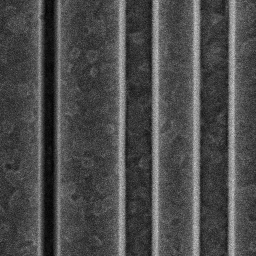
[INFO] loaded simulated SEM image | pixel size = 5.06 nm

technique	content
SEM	one or a few lines or trenches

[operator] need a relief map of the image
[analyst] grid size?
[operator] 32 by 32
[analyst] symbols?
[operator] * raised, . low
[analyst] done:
*****..********....******....***
*****..********....******....***
*****..********....******....***
*****..********....******....***
*****..********....******....***
*****..********....******....***
*****..********....******....***
*****..********....******....***
*****..********....******....***
*****..********....******....***
*****..********....******....***
*****..********....******....***
*****..********....******....***
*****..********....******....***
*****..********....******....***
*****..********....******....***
*****..********....******....***
*****..********....******....***
*****..********....******....***
*****..********....******....***
*****..********....******....***
*****..********....******....***
*****..********....******....***
*****..********....******....***
*****..********....******....***
*****..********....******....***
*****..********....******....***
*****..********....******....***
*****..********....******....***
*****..********....******....***
*****..********....******....***
*****..********....******....***